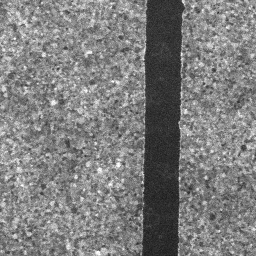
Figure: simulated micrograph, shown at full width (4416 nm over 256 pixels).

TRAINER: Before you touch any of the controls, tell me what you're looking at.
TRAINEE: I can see one or a few lines or trenches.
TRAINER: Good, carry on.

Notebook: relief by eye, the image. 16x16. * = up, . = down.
*********...****
*********..*****
*********..*****
*********..*****
*********..*****
*********..*****
*********..*****
*********..*****
*********..*****
*********..*****
*********..*****
*********..*****
*********..*****
*********..*****
*********..*****
*********..*****